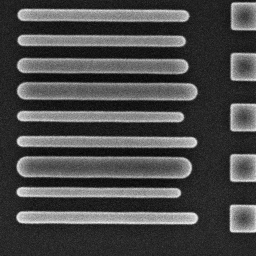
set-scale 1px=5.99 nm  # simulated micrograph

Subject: groups of lines, slits or small figures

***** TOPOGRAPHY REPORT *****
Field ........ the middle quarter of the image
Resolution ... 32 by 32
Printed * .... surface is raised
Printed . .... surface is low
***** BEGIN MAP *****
*******************************.
*******************************.
................................
................................
................................
********************************
********************************
********************************
********************************
................................
................................
................................
*****************************...
******************************..
................................
................................
................................
................................
********************************
********************************
********************************
................................
................................
******************************..
*******************************.
********************************
********************************
*******************************.
................................
................................
................................
*****************************...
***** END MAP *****